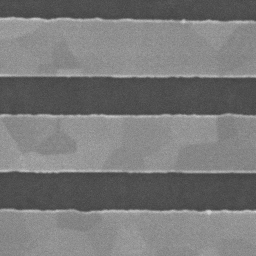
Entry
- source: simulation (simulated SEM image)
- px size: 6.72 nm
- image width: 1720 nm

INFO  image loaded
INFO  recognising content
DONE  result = lines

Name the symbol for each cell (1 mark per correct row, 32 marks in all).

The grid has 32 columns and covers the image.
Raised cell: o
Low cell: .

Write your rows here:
................................
................................
ooooooooooooo..oo...............
oooooooooooooooooooooooooooooooo
oooooooooooooooooooooooooooooooo
oooooooooooooooooooooooooooooooo
oooooooooooooooooooooooooooooooo
oooooooooooooooooooooooooooooooo
oooooooooooooooooooooooooooooooo
..............ooooooo.oooooooooo
................................
................................
................................
................................
oooooooooooooooooooooooooooooooo
oooooooooooooooooooooooooooooooo
oooooooooooooooooooooooooooooooo
oooooooooooooooooooooooooooooooo
oooooooooooooooooooooooooooooooo
oooooooooooooooooooooooooooooooo
oooooooooooooooooooooooooooooooo
....oo.o........ooo.o.oooooooooo
................................
................................
................................
................................
oooooooooo.ooooooooooooooooooooo
oooooooooooooooooooooooooooooooo
oooooooooooooooooooooooooooooooo
oooooooooooooooooooooooooooooooo
oooooooooooooooooooooooooooooooo
oooooooooooooooooooooooooooooooo